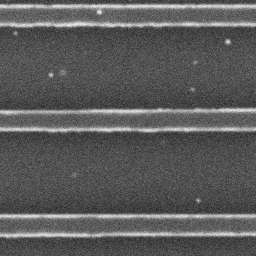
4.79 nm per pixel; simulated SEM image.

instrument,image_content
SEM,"lines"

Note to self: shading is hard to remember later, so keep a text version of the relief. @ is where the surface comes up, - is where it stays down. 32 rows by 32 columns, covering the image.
--------------------------------
@@@@@@@@@@@@@@@@@@@@@@@@@@@@@@@@
@@@@@@@@@@@@@@@@@@@@@@@@@@@@@@@@
--------------------------------
--------------------------------
--------------------------------
--------------------------------
--------------------------------
--------------------------------
--------------------------------
--------------------------------
--------------------------------
--------------------------------
--------------------------------
@@@@@@@@@@@@@@@@@@@@@@@@@@@@@@@@
@@@@@@@@@@@@@@@@@@@@@@@@@@@@@@@@
--------------------------------
--------------------------------
--------------------------------
--------------------------------
--------------------------------
--------------------------------
--------------------------------
--------------------------------
--------------------------------
--------------------------------
--------------------------------
@@@@@@@@@@@@@@@@@@@@@@@@@@@@@@@@
@@@@@@@@@@@@@@@@@@@@@@@@@@@@@@@@
@@@@@@@@@@@@@------@------------
--------------------------------
--------------------------------